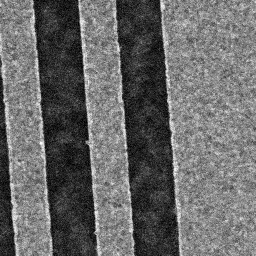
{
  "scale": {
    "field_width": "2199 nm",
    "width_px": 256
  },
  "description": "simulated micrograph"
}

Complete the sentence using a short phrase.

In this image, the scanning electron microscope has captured one or a few lines or trenches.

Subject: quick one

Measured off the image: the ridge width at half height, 307 nm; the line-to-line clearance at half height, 0.396 micrometres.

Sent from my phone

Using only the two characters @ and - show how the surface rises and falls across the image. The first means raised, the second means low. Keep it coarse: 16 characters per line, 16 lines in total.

@@---@@---@@@@@@
@@---@@---@@@@@@
@@---@@---@@@@@@
@@---@@---@@@@@@
@@---@@@--@@@@@@
@@---@@@--@@@@@@
@@@--@@@---@@@@@
@@@---@@---@@@@@
@@@---@@---@@@@@
-@@---@@---@@@@@
-@@---@@---@@@@@
-@@---@@---@@@@@
-@@---@@---@@@@@
-@@---@@---@@@@@
-@@---@@---@@@@@
-@@---@@---@@@@@